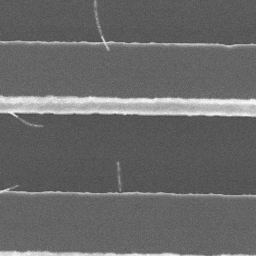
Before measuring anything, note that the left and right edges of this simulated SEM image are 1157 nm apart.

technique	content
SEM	lines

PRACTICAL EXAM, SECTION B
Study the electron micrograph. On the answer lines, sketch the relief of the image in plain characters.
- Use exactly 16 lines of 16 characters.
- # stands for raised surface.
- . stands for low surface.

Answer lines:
................
................
................
################
################
################
################
................
................
................
................
................
################
################
################
################